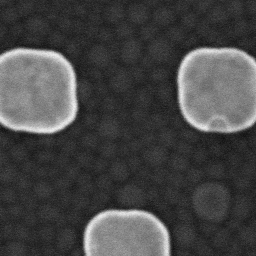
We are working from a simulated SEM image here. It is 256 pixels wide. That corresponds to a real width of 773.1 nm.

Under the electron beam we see raised bodies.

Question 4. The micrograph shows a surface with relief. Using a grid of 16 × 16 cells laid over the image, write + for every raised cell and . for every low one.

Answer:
................
................
................
++++........++++
+++++......+++++
+++++......+++++
+++++......+++++
++++........++++
................
................
................
................
................
......+++.......
.....+++++......
.....+++++......